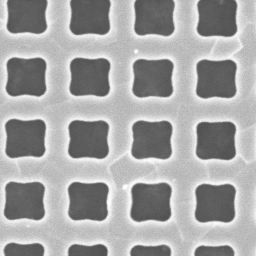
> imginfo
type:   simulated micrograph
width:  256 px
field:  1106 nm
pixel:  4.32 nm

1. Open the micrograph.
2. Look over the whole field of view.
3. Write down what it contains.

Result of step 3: a regular array of holes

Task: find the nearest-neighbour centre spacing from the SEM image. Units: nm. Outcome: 268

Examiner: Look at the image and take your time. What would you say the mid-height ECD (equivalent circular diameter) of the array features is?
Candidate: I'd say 188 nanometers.